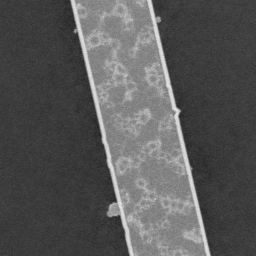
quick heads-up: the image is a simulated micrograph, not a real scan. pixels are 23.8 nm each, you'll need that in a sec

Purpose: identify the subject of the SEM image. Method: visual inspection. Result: one or a few lines or trenches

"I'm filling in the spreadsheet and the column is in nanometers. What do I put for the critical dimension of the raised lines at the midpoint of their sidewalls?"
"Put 1780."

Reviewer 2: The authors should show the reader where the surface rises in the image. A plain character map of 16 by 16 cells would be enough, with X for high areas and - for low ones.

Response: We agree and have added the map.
-----XXXX-------
-----XXXXX------
-----XXXXX------
-----XXXXX------
------XXXX------
------XXXXX-----
------XXXXX-----
------XXXXX-----
------XXXXX-----
-------XXXX-----
-------XXXXX----
-------XXXXX----
-------XXXXX----
--------XXXX----
--------XXXXX---
--------XXXXX---